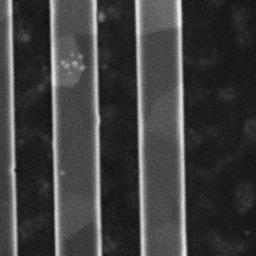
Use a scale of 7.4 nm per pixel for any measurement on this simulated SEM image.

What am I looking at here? one or a few lines or trenches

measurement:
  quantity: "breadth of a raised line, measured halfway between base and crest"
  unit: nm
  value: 322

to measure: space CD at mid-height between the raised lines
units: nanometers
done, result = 302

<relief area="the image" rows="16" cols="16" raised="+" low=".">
+..+++...++.....
+..+++...++.....
+..+++...++.....
+..+++...++.....
+..+++...++.....
+..+++...++.....
+..+++...++.....
+..+++...++.....
+..+++...++.....
+..+++...++.....
+..+++...++.....
+..+++...++.....
+..+++...++.....
+...++...++.....
+...++...+++....
+...++...+++....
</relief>